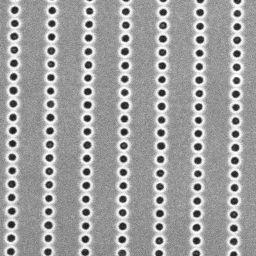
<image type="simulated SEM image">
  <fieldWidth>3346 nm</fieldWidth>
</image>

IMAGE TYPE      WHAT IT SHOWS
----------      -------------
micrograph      a regular array of holes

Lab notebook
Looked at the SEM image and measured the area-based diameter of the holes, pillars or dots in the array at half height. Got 8.29 pixels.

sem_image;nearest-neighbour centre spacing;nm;173